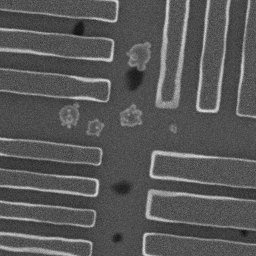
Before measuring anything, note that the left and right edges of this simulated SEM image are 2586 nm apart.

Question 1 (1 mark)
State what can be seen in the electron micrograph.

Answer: groups of lines, slits or small figures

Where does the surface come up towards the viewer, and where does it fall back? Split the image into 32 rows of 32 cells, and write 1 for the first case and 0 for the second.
11111111111111100000011000111001
00011111111111100000011000110001
00000000000001000000011000110001
00000000000000000000011000110001
11111111100000000000011000110011
11111111111111000000011000110011
00001111111111000100011001110011
00000000000001000100111001110011
00000000000000000000111001110011
11111111000000000000110001110011
11111111111111000000110001100011
01111111111111000000110001100011
00000000000010000000110001100011
00000000000000000000000001100011
00000000100000000000000000000001
00000000000000000000000000000000
00000000000000000000000000000000
11100000000000000000000000000000
11111111111100000000000000000000
01111111111110000001111100000000
00000000000100000001111111111111
11110000000000000001111111111111
11111111111100000000000111111111
00001111111100000000000000000000
00000000000000000001111110000000
11100000000000000001111111111111
11111111111100000001111111111111
00001111111100000000111111111111
00000000000000000000000000000111
11100000000000000011110000000000
11111111111000000011111111111110
00000011111000000011111111111111